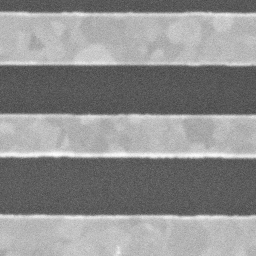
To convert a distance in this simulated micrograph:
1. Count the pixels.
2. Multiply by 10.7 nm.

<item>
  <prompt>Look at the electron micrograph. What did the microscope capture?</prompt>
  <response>lines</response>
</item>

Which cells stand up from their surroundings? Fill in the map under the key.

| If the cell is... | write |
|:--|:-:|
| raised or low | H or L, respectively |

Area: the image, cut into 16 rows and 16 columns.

LLLLLLLLLLLLLLLL
HHHHHHHHHHHHHHHH
HHHHHHHHHHHHHHHH
HHHHHHHHHHHHHHHH
LLLLLLLLLLLLLLLL
LLLLLLLLLLLLLLLL
LLLLLLLLLLLLLLLL
HHHHHHHHHHHHHHHH
HHHHHHHHHHHHHHHH
HHHHHHHHHHHHHHHH
LLLLLLLLLLLLLLLL
LLLLLLLLLLLLLLLL
LLLLLLLLLLLLLLLL
LLLLLLLLLLLLLLLL
HHHHHHHHHHHHHHHH
HHHHHHHHHHHHHHHH